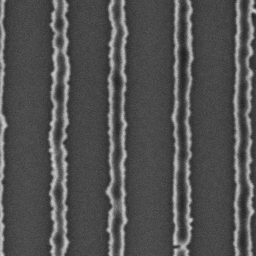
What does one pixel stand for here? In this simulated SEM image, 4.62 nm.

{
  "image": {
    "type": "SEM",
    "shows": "one or a few lines or trenches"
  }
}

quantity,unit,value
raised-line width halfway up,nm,61.3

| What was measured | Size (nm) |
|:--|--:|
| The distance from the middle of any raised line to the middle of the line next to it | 284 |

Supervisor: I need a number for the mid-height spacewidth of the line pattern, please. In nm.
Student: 225